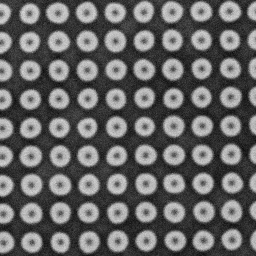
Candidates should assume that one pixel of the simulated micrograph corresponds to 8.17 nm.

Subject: an array of small figures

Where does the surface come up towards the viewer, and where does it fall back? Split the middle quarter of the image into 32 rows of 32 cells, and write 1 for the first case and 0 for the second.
10001111000111100011110001111000
10011111000111100011111001111100
10001111000111100011110001111000
00001111000011000001110000111000
00000000000000000000000000000000
00000000000000000000000000000000
00000110000011000001110000111000
10001111000111100011110001111000
10001111000111100011111001111100
10001111000111100011110001111100
10000110000111100001100000111000
00000000000000000000000000000000
00000000000000000000000000000000
00000000000011000001100000111000
10001111000111100011110001111100
10001111000111100011110001111100
10001111000111100011110001111100
10001111000111100001110000111000
00000000000000000000000000000000
00000000000000000000000000000000
00000000000000000001100000010000
10001111000011100011110001111100
10001111000111110011111001111100
10001111000111110011111001111100
10001111000111100001110000111000
00000000000000000000000000000000
00000000000000000000000000000000
00000000000000000000000000000000
10001111000011100011111001111100
10001111100111110011111001111100
11001111100111110011111001111100
10001111000111100001111000111100